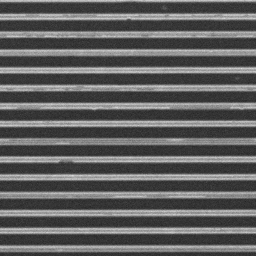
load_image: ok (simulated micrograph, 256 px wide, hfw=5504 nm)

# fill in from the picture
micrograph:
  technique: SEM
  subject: parallel lines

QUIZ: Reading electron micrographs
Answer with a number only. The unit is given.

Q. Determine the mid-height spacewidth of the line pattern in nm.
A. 269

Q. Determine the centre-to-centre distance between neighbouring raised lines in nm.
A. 384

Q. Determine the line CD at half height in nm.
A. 102